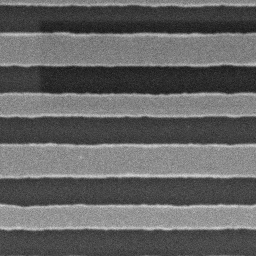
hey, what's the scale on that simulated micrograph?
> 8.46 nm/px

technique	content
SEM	lines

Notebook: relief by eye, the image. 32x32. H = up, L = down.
HHHHHHHHHHHHHHHHHHHHHHHHHHHHHHHH
LLLLLLLLLLLLLLLLLLLLLLLLLLLLLLLL
LLLLLLLLLLLLLLLLLLLLLLLLLLLLLLLL
LLLLLLLLLLLLLLLLLLLLLLLLLLLLLLLL
HHHHHHHHHHHHHHHHHHHHHHHHHHHHHHHH
HHHHHHHHHHHHHHHHHHHHHHHHHHHHHHHH
HHHHHHHHHHHHHHHHHHHHHHHHHHHHHHHH
HHHHHHHHHHHHHHHHHHHHHHHHHHHHHHHH
LLLLLLLLLLLLLLLLLLLLLLLLLLLLLLLL
LLLLLLLLLLLLLLLLLLLLLLLLLLLLLLLL
LLLLLLLLLLLLLLLLLLLLLLLLLLLLLLLL
LLLLLLLLLLLLLLLLLLLLLLLLLLLLLLLL
HHHHHHHHHHHHHHHHHHHHHHHHHHHHHHHH
HHHHHHHHHHHHHHHHHHHHHHHHHHHHHHHH
HHHHHLLLLLLLLLHHHHLHHHHHLLLLHHLL
LLLLLLLLLLLLLLLLLLLLLLLLLLLLLLLL
LLLLLLLLLLLLLLLLLLLLLLLLLLLLLLLL
LLLLLLLLLLLLLLLLLLLLLLLLLLLLLLLL
HHHHHHHHHHHHHHHHHHHHHHHHHHHHHHHH
HHHHHHHHHHHHHHHHHHHHHHHHHHHHHHHH
HHHHHHHHHHHHHHHHHHHHHHHHHHHHHHHH
HHHHHHHHHHHHHHHHHHHHHHHHHHHHHHHH
LLLLLLLLLLLLLLLLLLLLLLLLLLLLLLLL
LLLLLLLLLLLLLLLLLLLLLLLLLLLLLLLL
LLLLLLLLLLLLLLLLLLLLLLLLLLLLLLLL
LLLLLLLLLLLLLLLLLLLLLLLLLLLLLLLL
HHHHHHHHHHHHHHHHHHHHHHHHHHHHHHHH
HHHHHHHHHHHHHHHHHHHHHHHHHHHHHHHH
HHHHHHHLLLLLHHHHHHHHHHHHHHHLLLLH
LLLLLLLLLLLLLLLLLLLLLLLLLLLLLLLL
LLLLLLLLLLLLLLLLLLLLLLLLLLLLLLLL
LLLLLLLLLLLLLLLLLLLLLLLLLLLLLLLL